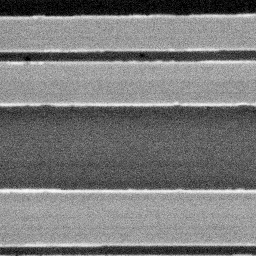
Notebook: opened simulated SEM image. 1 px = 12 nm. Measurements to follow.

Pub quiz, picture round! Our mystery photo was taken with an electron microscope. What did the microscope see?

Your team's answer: lines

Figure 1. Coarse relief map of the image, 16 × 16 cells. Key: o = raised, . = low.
................
oooooooooooooooo
oooooooooooooooo
oooooooooooooooo
oooooooooooooooo
oooooooooooooooo
oooooooooooooooo
................
................
................
................
................
oooooooooooooooo
oooooooooooooooo
oooooooooooooooo
oooooooooooooooo